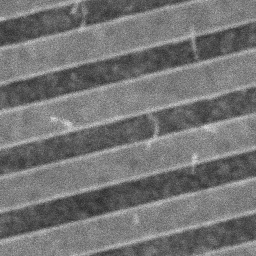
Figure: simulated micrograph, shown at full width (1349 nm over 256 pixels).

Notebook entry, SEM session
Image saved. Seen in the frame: one or a few lines or trenches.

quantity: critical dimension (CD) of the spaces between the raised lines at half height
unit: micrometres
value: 0.151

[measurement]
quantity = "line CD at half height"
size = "0.171 micrometres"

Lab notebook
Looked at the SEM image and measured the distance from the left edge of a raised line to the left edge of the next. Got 62.1 pixels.